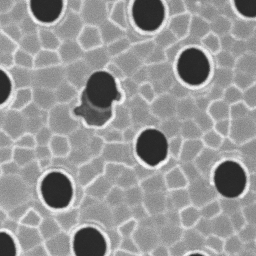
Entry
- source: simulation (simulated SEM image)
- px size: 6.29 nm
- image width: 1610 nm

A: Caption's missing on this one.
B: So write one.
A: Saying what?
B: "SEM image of holes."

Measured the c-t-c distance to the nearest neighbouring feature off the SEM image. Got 84.3 pixels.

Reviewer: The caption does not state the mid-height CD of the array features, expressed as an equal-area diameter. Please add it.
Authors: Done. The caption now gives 219 nm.